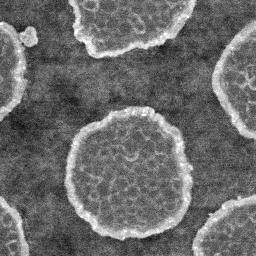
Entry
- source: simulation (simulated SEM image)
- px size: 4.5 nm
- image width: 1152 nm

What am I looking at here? raised bodies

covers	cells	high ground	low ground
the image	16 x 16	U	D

DDDDDUUUUUUUDDDD
DDDDDUUUUUUDDDDD
UUDDDUUUUUDDDDDU
UDDDDDDDDDDDDDUU
UDDDDDDDDDDDDDUU
UDDDDDDDDDDDDDUU
UDDDDDDDDDDDDDUU
DDDDDDDUUUDDDDDU
DDDDDUUUUUUDDDDD
DDDDDUUUUUUDDDDD
DDDDUUUUUUUUDDDD
DDDDUUUUUUUUDDDD
DDDDDUUUUUUUDDDU
UDDDDUUUUUUDDDUU
UDDDDDDUUUDDDUUU
UUDDDDDDDDDDUUUU